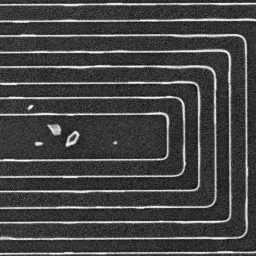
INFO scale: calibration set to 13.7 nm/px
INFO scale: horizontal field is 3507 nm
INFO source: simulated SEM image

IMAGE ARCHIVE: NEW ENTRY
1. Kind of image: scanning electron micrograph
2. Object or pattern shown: groups of lines, slits or small figures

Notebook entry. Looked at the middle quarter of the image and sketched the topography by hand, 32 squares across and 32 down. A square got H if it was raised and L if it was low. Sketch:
LLLLLLLLLLLLLLLLLLLLLLLLLLLLLLLL
HHHHHHHHHHHHHHHHHHHHHHHHHHHHHHHH
HHHHHHHHHHHHHHHHHHHHHHHHHHHHHHHH
HHHHHHHHHHHHHHHHHHHHHHHHHHHHHHHH
HHHHHHHHHHHHHHHHHHHHHHHHHHHHLLLH
LLLLLLLLLLLLLLLLLLLLLLLLLLLLLLLL
LLLLLLLLLLLLLLLLLLLLLLLLLLLLLLLL
LLLLLLLLLLLLLLLLLLLLLLLLLLLLLLLL
LLLLLLLLLLLLHHHHHHHLLLLHHHHHLLLL
HHHHHHHHHHHHHHHHHHHHHHHHHHHHHHLL
HHHHHHHHHHHHHHHHHHHHHHHHHHHHHHLL
HHHHHHHHHHHHHHHHHHHHHHHHHHHHHHLL
HHHHHHHHHHHHHHHHHHHLLLLLLHHHHHLL
LLLLLLLLLLLLLLLLLLLLLLLLLLHHHHLL
LLLLLLLLLLLLLLLLLLLLLLLLLLHHHHLL
LLLLLLLLLLLLLLLLLLLLLLLLLLHHHHLL
LLLLLLLLLLLLLLLLLLLLLLLLLLHHHHLL
LLHHLLLLLLLLLLLLLLLLLLLLLLHHHHLL
LHHLLLLLLLLLLLLLLLLLLLLLLLHHHHLL
LHHLLLLLLLLLLLLLLLLLLLLLLLHHHHLL
LLLLLLLLLLLLLLLLLLLLLLLLLLHHHHLL
LLLLLLLLLLLLLLLLLLLLLLLLLLHHHHLL
LLLLLLLLLLLLLLLLLLLLLLLLLLHHHHLL
LLLLLLLLLLLLLLLLLLLLLLLLLHHHHHLL
HHHHHHHHHHHHHHHHHHHHHHHHHHHHHHLL
HHHHHHHHHHHHHHHHHHHHHHHHHHHHHHLL
HHHHHHHHHHHHHHHHHHHHHHHHHHHHHHLL
HHHHHHHHHHHHHHHHHHHHHHHHHHHHHLLL
LLLLLLLLLLLLLLLLLLLLLLLLLLLLLLLL
LLLLLLLLLLLLLLLLLLLLLLLLLLLLLLLL
LLLLLLLLLLLLLLLLLLLLLLLLLLLLLLLL
LLLLLLLLLLLLLLLLLLLLLLLLLLLLLLLL